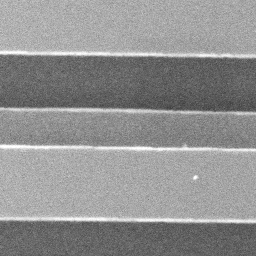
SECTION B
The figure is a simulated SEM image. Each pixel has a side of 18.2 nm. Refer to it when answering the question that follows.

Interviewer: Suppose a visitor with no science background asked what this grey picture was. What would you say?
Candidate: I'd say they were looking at lines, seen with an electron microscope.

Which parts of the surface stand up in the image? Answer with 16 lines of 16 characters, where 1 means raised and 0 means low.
1111111111111111
1111111111111111
1111111111111111
0000000000000000
0000000000000000
0000000000000000
0000000000000000
0000000000000000
0000000000000000
1111111111111111
1111111111111111
1111111111111111
1111111111111111
1111111111111111
0000000000000000
0000000000000000